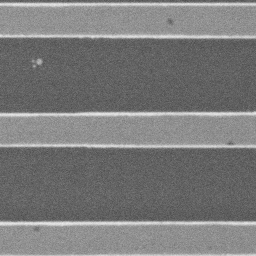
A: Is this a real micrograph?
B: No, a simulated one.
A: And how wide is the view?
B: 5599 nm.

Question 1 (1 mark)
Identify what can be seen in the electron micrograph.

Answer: lines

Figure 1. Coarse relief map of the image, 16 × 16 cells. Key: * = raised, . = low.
****************
****************
................
................
................
................
................
****************
****************
................
................
................
................
................
****************
****************